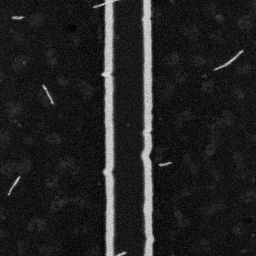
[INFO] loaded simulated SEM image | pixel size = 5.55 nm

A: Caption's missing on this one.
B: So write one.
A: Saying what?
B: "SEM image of one or a few lines or trenches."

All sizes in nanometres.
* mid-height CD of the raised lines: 216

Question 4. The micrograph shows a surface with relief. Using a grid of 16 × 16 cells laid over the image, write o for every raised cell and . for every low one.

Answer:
.......oo.......
.......oo.......
.......oo.......
.......oo.......
.......oo.......
.......oo.......
.......oo.......
.......oo.......
.......oo.......
.......oo.......
.......oo.......
.......oo.......
.......oo.......
.......oo.......
.......oo.......
.......oo.......